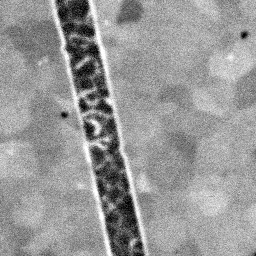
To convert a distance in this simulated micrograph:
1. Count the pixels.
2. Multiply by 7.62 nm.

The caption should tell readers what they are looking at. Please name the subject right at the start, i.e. one or a few lines or trenches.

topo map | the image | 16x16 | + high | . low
+++...++++++++++
++++..++++++++++
++++..++++++++++
++++..++++++++++
++++...+++++++++
+++++..+++++++++
+++++..+++++++++
+++++..+++++++++
+++++..+++++++++
+++++...++++++++
++++++..++++++++
++++++..++++++++
++++++..++++++++
++++++...+++++++
+++++++..+++++++
+++++++..+++++++